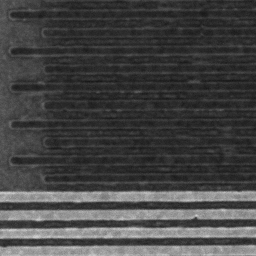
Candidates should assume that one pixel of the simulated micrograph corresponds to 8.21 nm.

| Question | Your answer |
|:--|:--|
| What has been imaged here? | parallel lines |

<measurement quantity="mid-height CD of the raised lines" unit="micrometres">0.0749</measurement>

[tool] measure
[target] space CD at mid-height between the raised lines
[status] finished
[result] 0.076 microns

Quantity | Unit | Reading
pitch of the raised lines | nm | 150